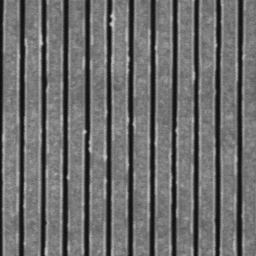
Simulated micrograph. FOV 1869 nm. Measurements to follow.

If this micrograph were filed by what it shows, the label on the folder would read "parallel lines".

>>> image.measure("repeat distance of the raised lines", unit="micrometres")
0.159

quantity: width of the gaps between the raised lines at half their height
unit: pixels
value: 5.51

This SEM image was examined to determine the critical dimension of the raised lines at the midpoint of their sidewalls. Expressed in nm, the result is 120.